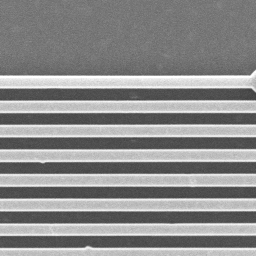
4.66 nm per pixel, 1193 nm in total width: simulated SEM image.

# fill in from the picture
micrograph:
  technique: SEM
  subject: parallel lines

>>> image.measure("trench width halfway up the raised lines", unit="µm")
0.0595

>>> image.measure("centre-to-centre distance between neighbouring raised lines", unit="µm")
0.115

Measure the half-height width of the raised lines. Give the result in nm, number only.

54.8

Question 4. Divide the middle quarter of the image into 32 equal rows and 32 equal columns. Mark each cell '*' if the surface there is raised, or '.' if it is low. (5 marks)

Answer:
................................
................................
................................
********************************
********************************
********************************
................................
................................
................................
********************************
********************************
********************************
................................
................................
................................
********************************
********************************
********************************
................................
................................
................................
.....................***********
********************************
********************************
................................
................................
................................
................................
********************************
********************************
................................
................................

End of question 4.